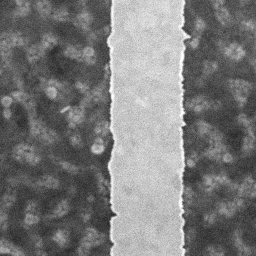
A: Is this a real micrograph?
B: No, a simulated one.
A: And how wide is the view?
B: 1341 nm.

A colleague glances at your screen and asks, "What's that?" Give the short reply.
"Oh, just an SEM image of one or a few lines or trenches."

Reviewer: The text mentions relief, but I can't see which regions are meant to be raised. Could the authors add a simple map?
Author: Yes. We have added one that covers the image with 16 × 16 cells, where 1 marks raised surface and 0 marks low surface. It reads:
0000000111100000
0000000111100000
0000000111110000
0000000111100000
0000000111100000
0000000111100000
0000000111100000
0000000111100000
0000000111100000
0000000111100000
0000000111110000
0000000111100000
0000000111100000
0000000111100000
0000000111100000
0000000111100000